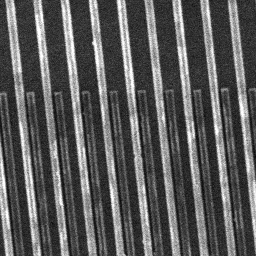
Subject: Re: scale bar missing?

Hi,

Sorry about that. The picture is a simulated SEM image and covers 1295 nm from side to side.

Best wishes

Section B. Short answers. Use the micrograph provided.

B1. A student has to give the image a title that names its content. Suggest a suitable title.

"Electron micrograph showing parallel lines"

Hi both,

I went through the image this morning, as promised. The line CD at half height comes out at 37.1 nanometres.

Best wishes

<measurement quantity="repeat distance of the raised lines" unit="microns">0.0701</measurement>